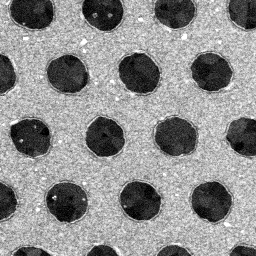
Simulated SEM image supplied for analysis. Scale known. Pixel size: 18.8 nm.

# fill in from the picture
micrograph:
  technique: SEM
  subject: a regular array of raised bodies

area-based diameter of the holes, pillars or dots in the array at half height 41.2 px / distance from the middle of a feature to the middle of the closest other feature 1340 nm